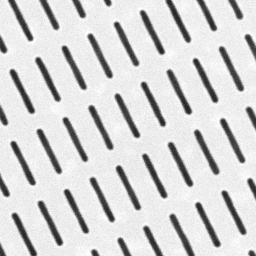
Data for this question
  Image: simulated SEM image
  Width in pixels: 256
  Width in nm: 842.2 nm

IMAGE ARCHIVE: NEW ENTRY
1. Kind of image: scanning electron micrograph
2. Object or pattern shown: a regular array of holes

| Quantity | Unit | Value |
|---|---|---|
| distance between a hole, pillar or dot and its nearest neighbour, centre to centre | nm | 93.8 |